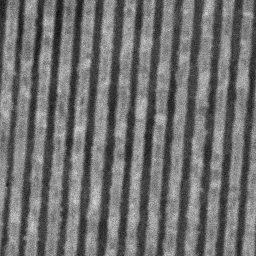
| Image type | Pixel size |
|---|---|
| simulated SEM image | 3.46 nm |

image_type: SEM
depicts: parallel lines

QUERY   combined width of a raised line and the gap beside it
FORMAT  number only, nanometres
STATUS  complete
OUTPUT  67.7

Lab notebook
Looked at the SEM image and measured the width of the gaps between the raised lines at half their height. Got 0.0396 micrometres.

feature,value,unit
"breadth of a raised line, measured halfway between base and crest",27.6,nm